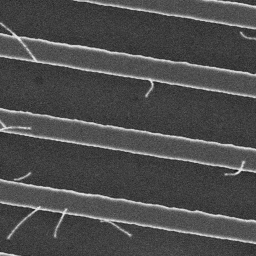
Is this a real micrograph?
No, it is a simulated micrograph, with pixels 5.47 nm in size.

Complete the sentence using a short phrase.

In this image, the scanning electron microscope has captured lines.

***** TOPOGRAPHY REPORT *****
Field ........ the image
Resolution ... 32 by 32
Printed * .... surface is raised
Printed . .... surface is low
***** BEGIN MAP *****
............*******************.
...................*************
.........................*******
...............................*
**..............................
********........................
**************..................
...******************...........
.........******************.....
...............*****************
.....................***********
............................****
................................
................................
******..........................
************....................
.*****************..............
.......******************.......
.............******************.
...................*************
..........................******
...............................*
*...............................
******..........................
*************...................
.*****************..............
.......******************.......
.............******************.
....................************
.........................*******
................................
................................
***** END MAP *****